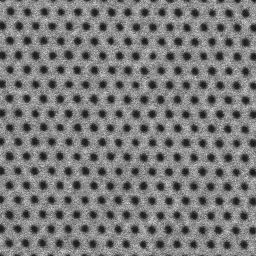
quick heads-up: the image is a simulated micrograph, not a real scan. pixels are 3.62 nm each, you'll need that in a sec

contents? a regular array of holes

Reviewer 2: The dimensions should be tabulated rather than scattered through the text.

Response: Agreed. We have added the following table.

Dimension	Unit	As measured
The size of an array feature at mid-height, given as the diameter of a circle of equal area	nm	27.1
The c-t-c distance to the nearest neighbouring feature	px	16.4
